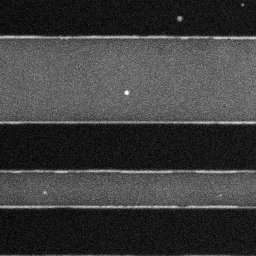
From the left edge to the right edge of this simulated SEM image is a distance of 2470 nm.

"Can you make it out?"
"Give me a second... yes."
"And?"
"lines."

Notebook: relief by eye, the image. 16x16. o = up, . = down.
oooooooooooooooo
oooooooooooooooo
................
................
................
................
................
................
oooooooooooooooo
oooooooooooooooo
oooooooooooooooo
................
................
oooooooooooooooo
oooooooooooooooo
oooooooooooooooo